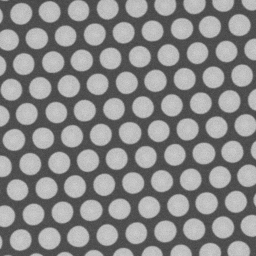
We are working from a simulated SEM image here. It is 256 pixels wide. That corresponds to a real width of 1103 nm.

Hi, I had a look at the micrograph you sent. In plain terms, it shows an array of small figures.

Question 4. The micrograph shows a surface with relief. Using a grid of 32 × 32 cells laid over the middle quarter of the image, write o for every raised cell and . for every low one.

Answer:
..ooooo...oooo....oo............
...ooo.......................oo.
..............ooo....oooo...oooo
ooo...ooooo..ooooo..ooooo...oooo
oooo..ooooo..ooooo..oooooo..oooo
oooo..ooooo..ooooo..ooooo...oooo
oooo..ooooo...oooo...ooo........
ooo.....oo......................
..................ooo....oooo...
....ooo....oooo...oooo...oooo...
...ooooo..ooooo..ooooo..oooooo..
o..ooooo..ooooo..ooooo..ooooo...
o..ooooo..ooooo...oooo...oooo...
...oooo....ooo..................
......................ooo....ooo
.oo.....ooo...ooooo..ooooo..oooo
oooo...ooooo..ooooo..ooooo..oooo
ooooo..ooooo..ooooo..ooooo...ooo
ooooo..ooooo..ooooo...oooo...ooo
oooo...oooo....ooo..............
.oo.......................ooo...
............ooo....oooo..ooooo..
....oooo...ooooo..ooooo..ooooo..
o..oooooo..ooooo..ooooo..ooooo..
o..oooooo..ooooo..ooooo...oooo..
o...oooo...oooo....ooo..........
o....oo........................o
................ooo...oooo....oo
.ooo....oooo...ooooo..ooooo..ooo
ooooo...ooooo..ooooo..ooooo..ooo
ooooo...ooooo..ooooo..ooooo..ooo
ooooo...oooo...oooo....ooo.....o